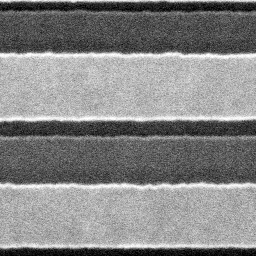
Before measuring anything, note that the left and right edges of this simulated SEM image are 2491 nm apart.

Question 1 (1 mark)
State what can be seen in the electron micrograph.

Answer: lines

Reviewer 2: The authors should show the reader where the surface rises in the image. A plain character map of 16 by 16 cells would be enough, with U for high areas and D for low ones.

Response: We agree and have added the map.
DDDDDDDDDDDDDDDD
DDDDDDDDDDDDDDDD
DDDDDDDDDDDDDDDD
UUUUUUUUUUUUUUUU
UUUUUUUUUUUUUUUU
UUUUUUUUUUUUUUUU
UUUUUUUUUUUUUUUU
DDDDDDDDDDDDDDDD
DDDDDDDDDDDDDDDD
DDDDDDDDDDDDDDDD
DDDDDDDDDDDDDDDD
DDDDDDDDDDDDDDDD
UUUUUUUUUUUUUUUU
UUUUUUUUUUUUUUUU
UUUUUUUUUUUUUUUU
DDDDDDDDDDDDDDDD